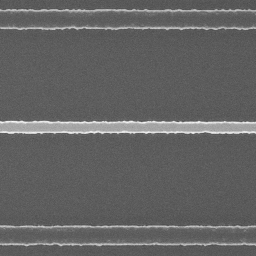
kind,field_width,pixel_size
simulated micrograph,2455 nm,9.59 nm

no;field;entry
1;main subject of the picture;lines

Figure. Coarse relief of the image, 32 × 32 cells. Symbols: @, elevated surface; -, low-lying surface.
--------------------------------
@@@@@@@@@@@@@@@@@@@@@@@@@@@@@@@@
@@@@@@@@@@@@@@@@@@@@@@@@@@@@@@@@
@@@@@@@@@@@@@@@@@@@@@@@@@@@@@@@@
--------------------------------
--------------------------------
--------------------------------
--------------------------------
--------------------------------
--------------------------------
--------------------------------
--------------------------------
--------------------------------
--------------------------------
--------------------------------
@@@@@@@@@@@@@@@@@@@@@@@@@@@@@@@@
@@@@@@@@@@@@@@@@@@@@@@@@@@@@@@@@
--------------------------------
--------------------------------
--------------------------------
--------------------------------
--------------------------------
--------------------------------
--------------------------------
--------------------------------
--------------------------------
--------------------------------
--------------------------------
@@@@@@@@@@@@@@@@@@@@@@@@@@@@@@@@
@@@@@@@@@@@@@@@@@@@@@@@@@@@@@@@@
@@@@@@@@@@@@@@@@@@@@@@@@@@@@@@@@
--------------------------------